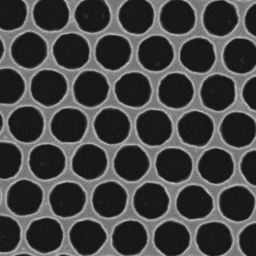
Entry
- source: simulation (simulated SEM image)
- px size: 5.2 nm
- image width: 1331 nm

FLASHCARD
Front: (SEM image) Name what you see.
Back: a regular array of holes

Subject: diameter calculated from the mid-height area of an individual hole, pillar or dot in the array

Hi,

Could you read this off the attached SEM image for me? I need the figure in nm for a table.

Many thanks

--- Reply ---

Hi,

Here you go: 182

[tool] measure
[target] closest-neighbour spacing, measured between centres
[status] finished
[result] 218 nm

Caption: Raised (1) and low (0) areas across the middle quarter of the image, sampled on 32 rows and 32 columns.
00000111110000011111000000111100
11111111111111111111100011111111
11110000011111110001111111100011
11100000001111000000011110000001
11100000000110000000011100000000
01000000000110000000001100000000
01100000000110000000001100000000
11100000000110000000001100000000
11100000001110000000011100000000
11110000011111000000011110000001
11111100111111110001111111000011
00001111110001111111111111111111
00000111100000011110000001111110
00000011000000001110000000111100
00000011000000001100000000011000
00000011000000000100000000010000
00000111000000001100000000011000
00000111000000001110000000011000
00001111100000011110000000111000
00011111110000111111000001111100
11111000111111110011111111111111
11100000001111000001111110000111
11100000001110000000111100000001
11000000000110000000011000000000
11000000000100000000011000000000
11000000001110000000011000000000
11000000001110000000011000000000
11100000001110000000111100000001
11111000111111100001111110000001
11111111111011111111111111100111
00001111000000111111000011111110
00000111000000011100000001111100